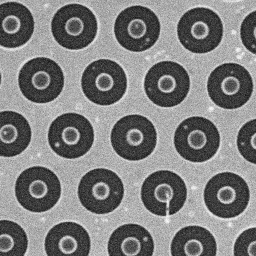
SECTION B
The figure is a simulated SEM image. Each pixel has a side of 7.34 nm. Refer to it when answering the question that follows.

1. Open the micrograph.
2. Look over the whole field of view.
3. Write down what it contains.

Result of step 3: an array of small figures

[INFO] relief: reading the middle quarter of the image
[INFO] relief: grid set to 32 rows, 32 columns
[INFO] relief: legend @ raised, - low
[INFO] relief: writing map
@@@@@@--------@@@@@@@@-------@@@
@@@@@----------@@@@@@---------@@
@@@@@-----@-----@@@@-----------@
@@@@----@@@@----@@@@----@@@----@
@@@@----@@@@----@@@@----@@@@----
@@@@----@@@@----@@@@----@@@@----
@@@@------------@@@@----@@@----@
@@@@@----------@@@@@-----------@
@@@@@@---------@@@@@@---------@@
@@@@@@@------@@@@@@@@@-------@@@
@@@@@@@@@--@@@@@@@@@@@@@----@@@@
@@@@@@@@@@@@@@@@@@@@@@@@@@@@@@@@
----@@@@@@@@@@@@@--@@@@@@@@@@@@@
-----@@@@@@@@@-------@@@@@@@@@@-
------@@@@@@@---------@@@@@@@---
-------@@@@@-----------@@@@@----
@@@-----@@@@-----------@@@@@----
@@@@----@@@@----@@@----@@@@@---@
@@@@----@@@@----@@@----@@@@----@
@@@----@@@@@----@@@----@@@@----@
-------@@@@@-----------@@@@@----
------@@@@@@----------@@@@@@----
-----@@@@@@@@---------@@@@@@@---
---@@@@@@@@@@@-------@@@@@@@@@--
@@@@@@@@@@@@@@@@@@@@@@@@@@@@@@@@
@@@@@@@@@@@@@@@@@@@@@@@@@@@@@@@@
@@@@@@------@@@@@@@@@@@@--@@@@@@
@@@@@--------@@@@@@@@@------@@@@
@@@@----------@@@@@@@---------@@
@@@@-----------@@@@@----------@@
@@@-----@@@----@@@@-----@@-----@
@@@-----@@@----@@@@----@@@@----@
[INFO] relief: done